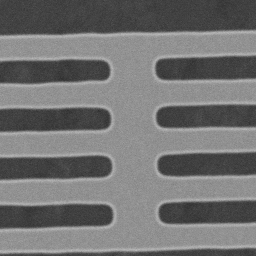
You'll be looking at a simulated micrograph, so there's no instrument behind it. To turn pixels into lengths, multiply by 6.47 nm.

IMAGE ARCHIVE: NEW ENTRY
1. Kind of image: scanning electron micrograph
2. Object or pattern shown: groups of lines, slits or small figures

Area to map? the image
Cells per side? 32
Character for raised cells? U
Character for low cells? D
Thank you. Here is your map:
DDDDDDDDDDDDDDDDDDDDDDDDDDDDDDDD
DDDDDDDDDDDDDDDDDDDDDDDDDDDDDDDD
DDDDDDDDDDDDDDDDDDDDDDDDDDDDDDDD
DDDDDDDDDDDDDDDDDDDDDDDDDDDDDDDD
DDUUUUUUUUUUUUUUUUUUUUUUUUUUUUUU
UUUUUUUUUUUUUUUUUUUUUUUUUUUUUUUU
UUUUUUUUUUUUUUUUUUUUUUUUUUUUUUUU
UUDDDDUDDDDDDUUUUUUUDDDDDDDDDDDD
DDDDDDDDDDDDDDUUUUUDDDDDDDDDDDDD
DDDDDDDDDDDDDDUUUUUUDDDDDDDDDDDD
DDDDDUUUUUUUUUUUUUUUUUUUUUUUUUUU
UUUUUUUUUUUUUUUUUUUUUUUUUUUUUUUU
UUUUUUUUUUUUUUUUUUUUUUUUUUUUUUUU
UDDDDDDDDDDDDUUUUUUUDDDDDDDDDDDD
DDDDDDDDDDDDDDUUUUUDDDDDDDDDDDDD
DDDDDDDDDDDDDDUUUUUUDDDDDDDDDDDD
DDDUDUUUUUUUUUUUUUUUUUUUUUUUUUUU
UUUUUUUUUUUUUUUUUUUUUUUUUUUUUUUU
UUUUUUUUUUUUUUUUUUUUUUUUUUUUUUUU
UUDDDUUDDDDDDUUUUUUUDDDDDDDDDDDD
DDDDDDDDDDDDDDUUUUUUDDDDDDDDDDDD
DDDDDDDDDDDDDDUUUUUUDDDDDDDDDDDD
DDDDDDDDDUUUUUUUUUUUUUUUUUUUUUUU
UUUUUUUUUUUUUUUUUUUUUUUUUUUUUUUU
UUUUUUUUUUUUUUUUUUUUUUUUUUUUUUUU
UUUUUUUDDDDDDUUUUUUUDDDDDDDDDDDD
DDDDDDDDDDDDDDUUUUUUDDDDDDDDDDDD
DDDDDDDDDDDDDDUUUUUUDDDDDDDDDDDD
DDDDDDDUUUUUUUUUUUUUUUUUUUUUUUUU
UUUUUUUUUUUUUUUUUUUUUUUUUUUUUUUU
UUUUUUUUUUUUUUUUUUUUUUUUUUUUUUUU
UDDDDDDDDDDDDDDDDDDDDDDDDDDDDDDD